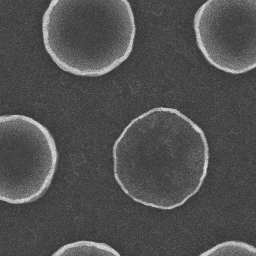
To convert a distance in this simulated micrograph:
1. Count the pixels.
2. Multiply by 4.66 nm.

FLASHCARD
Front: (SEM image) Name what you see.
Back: raised bodies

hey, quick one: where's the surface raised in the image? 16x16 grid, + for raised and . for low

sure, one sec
...+++++.....+++
...+++++....++++
...+++++....++++
...+++++.....+++
....+++.........
................
................
++..............
+++.............
+++.............
+++.............
+++.............
++..............
................
................
....+++......+++